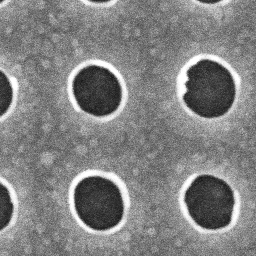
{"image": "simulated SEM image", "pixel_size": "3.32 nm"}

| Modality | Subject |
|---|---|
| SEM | holes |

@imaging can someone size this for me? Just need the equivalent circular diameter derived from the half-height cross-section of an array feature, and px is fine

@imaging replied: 53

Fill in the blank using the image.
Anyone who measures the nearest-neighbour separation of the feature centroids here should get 371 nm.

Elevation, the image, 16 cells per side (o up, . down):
oooooooooooooooo
oooooooooooooooo
oooooooooooooooo
oooooooooooooooo
ooooo..ooooo..oo
.oooo...oooo...o
.oooo...oooo...o
oooooooooooooooo
oooooooooooooooo
oooooooooooooooo
oooooooooooooooo
ooooo..ooooo..oo
.oooo...oooo...o
.oooo...oooo..oo
oooooooooooooooo
oooooooooooooooo